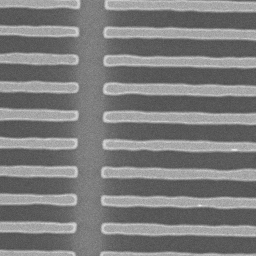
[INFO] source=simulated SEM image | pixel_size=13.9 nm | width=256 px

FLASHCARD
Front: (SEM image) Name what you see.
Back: groups of lines, slits or small figures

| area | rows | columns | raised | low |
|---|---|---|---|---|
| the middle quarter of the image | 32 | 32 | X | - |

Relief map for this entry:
--------------------------------
--------------------------------
--------------------------------
--------------------------------
--------------------------------
XXX-------XXXXXXXXXXXXXXXXXXXXXX
XXX-------XXXXXXXXXXXXXXXXXXXXXX
-----------XXXX----XXXXXXXXXXXXX
--------------------------------
--------------------------------
--------------------------------
--------------------------------
XXX-------XXXXXXXXXXXXXXXXXXXXXX
XXX-------XXXXXXXXXXXXXXXXXXXXXX
---------------------XXXXXXXXXXX
--------------------------------
--------------------------------
--------------------------------
--------------------------------
XXX-------XXXXXXXXXXXXXXXXXXXXXX
XXX-------XXXXXXXXXXXXXXXXXXXXXX
-----------------------------XXX
--------------------------------
--------------------------------
--------------------------------
--------------------------------
XXX-------XXXXXXXXXXXXXXXXXXXXXX
XXX-------XXXXXXXXXXXXXXXXXXXXXX
--------------------XXXXXXXXXXXX
--------------------------------
--------------------------------
--------------------------------